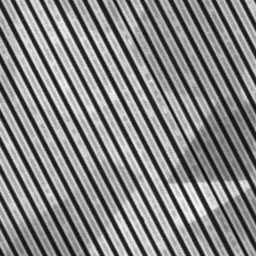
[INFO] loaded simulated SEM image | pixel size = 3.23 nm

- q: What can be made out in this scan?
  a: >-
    parallel lines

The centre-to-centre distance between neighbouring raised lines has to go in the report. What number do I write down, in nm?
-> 41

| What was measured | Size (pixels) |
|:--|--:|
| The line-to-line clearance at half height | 5.85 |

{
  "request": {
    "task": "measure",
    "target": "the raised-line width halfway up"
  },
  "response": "0.0219 micrometres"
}